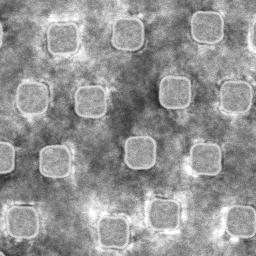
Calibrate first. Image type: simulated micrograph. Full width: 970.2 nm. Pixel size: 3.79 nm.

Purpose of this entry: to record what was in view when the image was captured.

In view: a regular array of raised bodies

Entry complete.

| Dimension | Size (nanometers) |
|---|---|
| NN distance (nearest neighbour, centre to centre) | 247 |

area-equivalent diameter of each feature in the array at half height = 0.126 microns